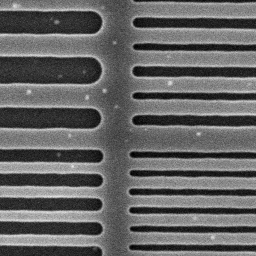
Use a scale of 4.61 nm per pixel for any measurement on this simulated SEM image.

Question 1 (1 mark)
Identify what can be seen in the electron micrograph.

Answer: groups of lines, slits or small figures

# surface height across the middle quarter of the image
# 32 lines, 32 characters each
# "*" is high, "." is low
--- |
.........*********...........**.
..........*******...............
.........********...............
.........***********************
........************************
********************************
********************************
*****************...............
*****************...............
********************************
********************************
........************************
.........**********...***...**..
..........*******...............
.........********...............
.........*********..............
********************************
********************************
********************************
********************************
********************************
.........***********************
..........******................
..........*******...............
.........***********************
********************************
*****************......**.......
.........*******................
..........*********************.
..........**********************
.........***********************
****************................